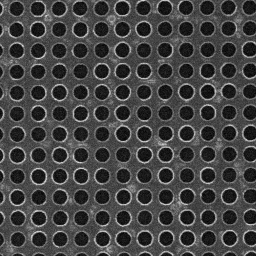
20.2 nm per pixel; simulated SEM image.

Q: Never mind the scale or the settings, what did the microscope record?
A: a regular array of holes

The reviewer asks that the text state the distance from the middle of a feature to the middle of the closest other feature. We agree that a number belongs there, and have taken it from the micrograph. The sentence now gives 0.42 um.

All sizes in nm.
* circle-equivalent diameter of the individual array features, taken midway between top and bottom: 297